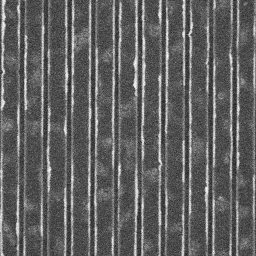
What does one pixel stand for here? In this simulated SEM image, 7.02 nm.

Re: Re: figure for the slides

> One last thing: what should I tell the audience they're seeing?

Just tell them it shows parallel lines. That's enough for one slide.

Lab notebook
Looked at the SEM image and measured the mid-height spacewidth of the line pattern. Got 33.4 nm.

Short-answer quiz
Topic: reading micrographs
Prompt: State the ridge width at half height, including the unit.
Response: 133 nanometers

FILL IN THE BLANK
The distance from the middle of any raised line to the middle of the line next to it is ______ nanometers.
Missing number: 166